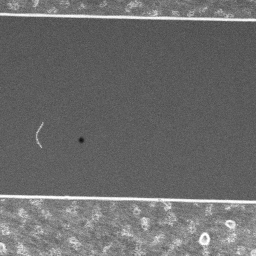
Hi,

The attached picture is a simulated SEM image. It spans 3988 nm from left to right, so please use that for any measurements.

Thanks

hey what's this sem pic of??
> one or a few lines or trenches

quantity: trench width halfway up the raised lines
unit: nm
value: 2830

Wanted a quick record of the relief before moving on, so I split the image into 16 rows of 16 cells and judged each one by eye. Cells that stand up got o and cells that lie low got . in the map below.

oooooooooooooooo
................
................
................
................
................
................
................
................
................
................
................
oooooooooo......
oooooooooooooooo
oooooooooooooooo
oooooooooooooooo